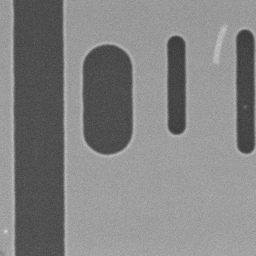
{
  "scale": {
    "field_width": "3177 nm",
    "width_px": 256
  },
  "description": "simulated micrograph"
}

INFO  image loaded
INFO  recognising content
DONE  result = groups of lines, slits or small figures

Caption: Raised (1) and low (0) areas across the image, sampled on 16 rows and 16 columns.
1000111111111111
1000111111111111
1000111111111110
1000100011001110
1000100011001110
1000100011001110
1000100011001110
1000100011001110
1000100011111110
1000110111111110
1000111111111111
1000111111111111
1000111111111111
1000111111111111
1000111111111111
1000111111111111